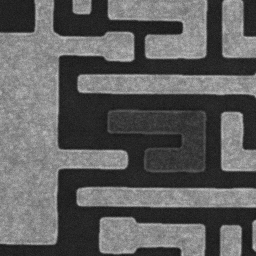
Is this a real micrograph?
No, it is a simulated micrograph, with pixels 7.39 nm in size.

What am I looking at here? wiring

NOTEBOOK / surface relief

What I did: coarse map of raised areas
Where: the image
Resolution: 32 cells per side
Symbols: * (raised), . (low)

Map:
....***..**...************..**..
.....**..**...************..**..
.....**...............****..**..
....***................***..**..
********.....****..*******..***.
*****************.********..****
*****************.********..****
*******........*................
*******.........................
*******...*************........*
*******...**********************
*******...**********************
*******.........................
*******.........................
*******.......************..**..
*******.......************..**..
*******.......************..**..
*******................***..**..
*******...............****..**..
****************..********..****
****************..********..****
*******.........................
*******.........................
*******...******................
*******...**********************
*******...**********************
*******.........................
*******......****...............
*******......************...**..
*******.....**************..**..
............**************..**..
.............****......***..**..